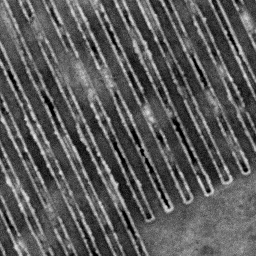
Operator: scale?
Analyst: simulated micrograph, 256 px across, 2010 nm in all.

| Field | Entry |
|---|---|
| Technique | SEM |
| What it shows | parallel lines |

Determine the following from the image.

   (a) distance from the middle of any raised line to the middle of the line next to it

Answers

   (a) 0.169 microns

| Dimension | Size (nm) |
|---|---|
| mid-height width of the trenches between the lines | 95.9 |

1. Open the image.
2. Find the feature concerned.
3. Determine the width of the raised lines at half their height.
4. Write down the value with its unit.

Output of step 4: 73.7 nm